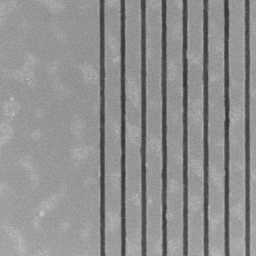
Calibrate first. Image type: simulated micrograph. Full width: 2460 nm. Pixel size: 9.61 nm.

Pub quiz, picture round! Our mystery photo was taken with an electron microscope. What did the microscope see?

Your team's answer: parallel lines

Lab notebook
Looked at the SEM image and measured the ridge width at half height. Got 0.151 µm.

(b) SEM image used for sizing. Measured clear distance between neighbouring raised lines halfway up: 0.0504 micrometres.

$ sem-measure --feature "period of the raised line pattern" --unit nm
199